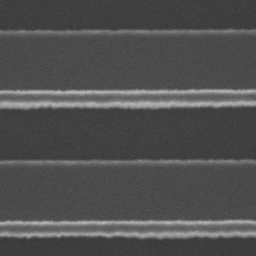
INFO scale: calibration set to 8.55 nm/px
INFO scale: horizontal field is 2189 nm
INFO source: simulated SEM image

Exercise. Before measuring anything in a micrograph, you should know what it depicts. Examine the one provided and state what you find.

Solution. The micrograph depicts lines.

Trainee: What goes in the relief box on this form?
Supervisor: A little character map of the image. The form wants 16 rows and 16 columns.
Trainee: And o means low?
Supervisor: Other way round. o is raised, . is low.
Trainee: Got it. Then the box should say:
................
................
oooooooooooooooo
oooooooooooooooo
oooooooooooooooo
oooooooooooooooo
oooooooooooooooo
................
................
................
oooooooooooooooo
oooooooooooooooo
oooooooooooooooo
oooooooooooooooo
oooooooooooooooo
................